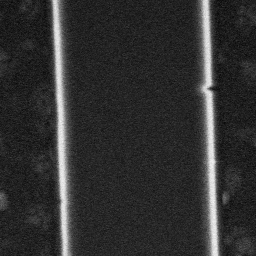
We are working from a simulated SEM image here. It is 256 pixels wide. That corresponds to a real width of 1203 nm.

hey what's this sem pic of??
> one or a few lines or trenches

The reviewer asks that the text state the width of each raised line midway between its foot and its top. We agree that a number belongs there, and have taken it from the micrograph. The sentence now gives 0.705 µm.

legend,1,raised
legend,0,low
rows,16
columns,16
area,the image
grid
0001111111111000
0001111111111000
0000111111111000
0000111111111000
0000111111111000
0000111111111000
0000111111111000
0000111111111000
0000111111111000
0000111111111000
0000111111111000
0000111111111000
0000111111111000
0000111111111000
0000111111111000
0000111111111000